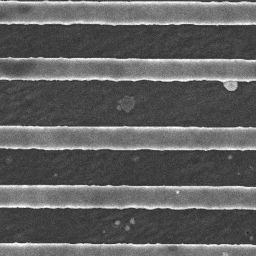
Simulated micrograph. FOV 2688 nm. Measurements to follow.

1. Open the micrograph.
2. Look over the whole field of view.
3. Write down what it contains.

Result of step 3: lines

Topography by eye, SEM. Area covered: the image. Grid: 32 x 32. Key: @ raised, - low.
@@@@@@@@@@@@@@@@@@@@@@@@@@@@@@@@
@@@@@@@@@@@@@@@@@@@@@@@@@@@@@@@@
@@@@@@@@@@@@@@@@@@@@@@@@@@@@@@@@
--------------------------------
--------------------------------
--------------------------------
--------------------------------
@@@@@@@@@@@@@@@@@@@@@@@@@@@@@@@-
@@@@@@@@@@@@@@@@@@@@@@@@@@@@@@@@
@@@@@@@@@@@@@@@@@@@@@@@@@@@@@@@@
--------------------------------
--------------------------------
--------------------------------
--------------------------------
--------------------------------
--------------------------------
@@@@@@@@@@@@@@@@@@@@@@@@@@@@@@@@
@@@@@@@@@@@@@@@@@@@@@@@@@@@@@@@@
@@@@@@@@@@@@@@@@@@@@@@@@@@@@@@@@
--------------------------------
--------------------------------
--------------------------------
--------------------------------
@@@@@@@@@@@@@@@@@@@@@@@@@@@@@@@@
@@@@@@@@@@@@@@@@@@@@@@@@@@@@@@@@
@@@@@@@@@@@@@@@@@@@@@@@@@@@@@@@@
--------------------------------
--------------------------------
--------------------------------
--------------------------------
@@@@@@@@@@@@--@@@-@@--@---------
@@@@@@@@@@@@@@@@@@@@@@@@@@@@@@@@